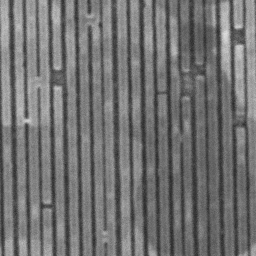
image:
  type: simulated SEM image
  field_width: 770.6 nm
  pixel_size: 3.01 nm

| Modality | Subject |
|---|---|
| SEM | parallel lines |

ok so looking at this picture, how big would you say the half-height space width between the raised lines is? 0.0154 microns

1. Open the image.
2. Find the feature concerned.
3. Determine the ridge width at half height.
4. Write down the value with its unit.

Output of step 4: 23.3 nm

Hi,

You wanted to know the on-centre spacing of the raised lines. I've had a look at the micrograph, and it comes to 39.1 nanometers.